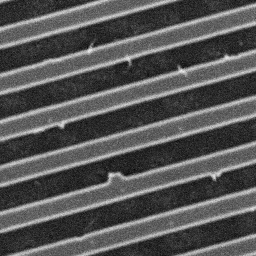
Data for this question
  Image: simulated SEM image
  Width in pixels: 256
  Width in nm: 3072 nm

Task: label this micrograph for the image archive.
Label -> parallel lines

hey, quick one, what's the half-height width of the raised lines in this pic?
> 240 nm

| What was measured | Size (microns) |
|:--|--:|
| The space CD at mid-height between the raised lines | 0.301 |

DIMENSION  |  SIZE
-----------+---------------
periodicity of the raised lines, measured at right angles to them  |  533 nanometres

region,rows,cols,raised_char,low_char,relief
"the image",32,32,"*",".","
...........*********............
........********............****
....*********............*******
*********............*********..
******...........**********.....
**............*********.........
..........*********............*
......**********...........*****
...*********............********
*********...........**********..
*****............*********......
*............*********..........
.........*********............**
......*********............*****
..*********............*********
********...........*********....
****............*********.......
*...........*********...........
........*********............***
.....*********............******
.*********............*********.
*******...........**********....
***...........**********........
...........*********............
........********............****
....*********............*******
**********...........*********..
******...........**********.....
**............*********.........
...........*********...........*
.......*********...........*****
...*********............********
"